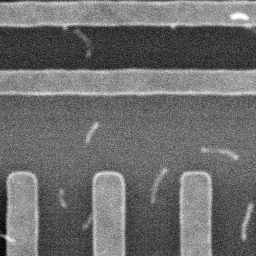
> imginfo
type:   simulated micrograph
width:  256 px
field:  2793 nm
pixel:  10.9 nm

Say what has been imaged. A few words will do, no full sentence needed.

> groups of lines, slits or small figures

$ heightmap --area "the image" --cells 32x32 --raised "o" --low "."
oooooooooooooooooooooooooooooooo
oooooooooooooooooooooooooooooooo
oooooooooooooooooooooooooooooooo
................................
................................
................................
................................
................................
................................
oooooooooooooooooooooooooooooooo
oooooooooooooooooooooooooooooooo
oooooooooooooooooooooooooooooooo
................................
................................
................................
................................
................................
................................
................................
................................
................................
................................
.oooo.......ooo........ooo......
.oooo.......ooo........ooo......
.oooo.......ooo........ooo......
.oooo.......ooo........ooo......
.oooo.......ooo........ooo......
.oooo.......ooo........ooo......
.oooo.......ooo........ooo......
.oooo.......ooo........ooo......
.oooo.......ooo........ooo......
.oooo.......ooo........ooo......